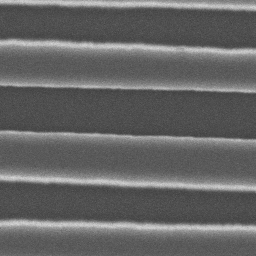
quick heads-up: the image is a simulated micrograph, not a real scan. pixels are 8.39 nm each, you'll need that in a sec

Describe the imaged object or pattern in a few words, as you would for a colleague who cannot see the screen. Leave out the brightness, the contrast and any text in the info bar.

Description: lines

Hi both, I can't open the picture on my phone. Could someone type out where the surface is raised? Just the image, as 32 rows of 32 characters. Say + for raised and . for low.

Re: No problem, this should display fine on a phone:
.....................+++++++++++
................................
................................
................................
................................
+++.............................
++++++++++++++++++++++++++++.+++
++++++++++++++++++++++++++++++++
++++++++++++++++++++++++++++++++
++++++++++++++++++++++++++++++++
++++++++++++++++++++++++++++++++
................................
................................
................................
................................
................................
++..............................
++++++++++++++++++++++++++++++..
++++++++++++++++++++++++++++++++
++++++++++++++++++++++++++++++++
++++++++++++++++++++++++++++++++
++++++++++++++++++++++++++++++++
........++++++++++++++++++++++++
..............................++
................................
................................
................................
................................
++++++++++++++++++++++++.....+..
++++++++++++++++++++++++++++++++
++++++++++++++++++++++++++++++++
++++++++++++++++++++++++++++++++